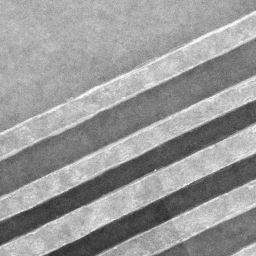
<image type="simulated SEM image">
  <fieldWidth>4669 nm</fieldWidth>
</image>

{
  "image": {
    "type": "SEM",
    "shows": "parallel lines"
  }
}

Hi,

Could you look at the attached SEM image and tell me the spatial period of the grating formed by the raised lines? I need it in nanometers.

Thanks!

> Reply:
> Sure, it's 947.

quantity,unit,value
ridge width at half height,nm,411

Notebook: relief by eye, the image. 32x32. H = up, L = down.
LLLLLLLLLLLLLLLLLLLLLLLLLLLLLLLL
LLLLLLLLLLLLLLLLLLLLLLLLLLLLLLLL
LLLLLLLLLLLLLLLLLLLLLLLLLLLLLLHH
LLLLLLLLLLLLLLLLLLLLLLLLLLLLHHHH
LLLLLLLLLLLLLLLLLLLLLLLLLLHHHHHH
LLLLLLLLLLLLLLLLLLLLLLLLHHHHHHLL
LLLLLLLLLLLLLLLLLLLLLLHHHHHHLLLL
LLLLLLLLLLLLLLLLLLLLHHHHHHLLLLLL
LLLLLLLLLLLLLLLLLLHHHHHHLLLLLLLL
LLLLLLLLLLLLLLLHHHHHHHLLLLLLLLLL
LLLLLLLLLLLLLHHHHHHHLLLLLLLLLLHH
LLLLLLLLLLLHHHHHHLLLLLLLLLLLHHHH
LLLLLLLLLHHHHHHLLLLLLLLLLLHHHHHH
LLLLLLLHHHHHHHLLLLLLLLLLHHHHHLLL
LLLLLHHHHHHLLLLLLLLLLLHHHHHLLLLL
LLLHHHHHHLLLLLLLLLLLHHHHHLLLLLLL
HHHHHHHLLLLLLLLLLHHHHHHLLLLLLLHH
HHHHHLLLLLLLLLLHHHHHHLLLLLLLHHHH
HHHLLLLLLLLLLHHHHHHLLLLLLLHHHHHH
HLLLLLLLLLLHHHHHHLLLLLLLHHHHHHHL
LLLLLLLLLHHHHHHLLLLLLLHHHHHHHLLL
LLLLLLLHHHHHHLLLLLLLHHHHHHHLLLLL
LLLLLHHHHHHLLLLLLHHHHHHHHLLLLLLL
LLLHHHHHHLLLLLLHHHHHHHHLLLLLLLHH
LHHHHHHLLLLLLHHHHHHHHLLLLLLLHHHH
HHHHHLLLLLLHHHHHHHHLLLLLLHHHHHHH
HHHLLLLLLHHHHHHHLLLLLLLHHHHHHHLL
LLLLLLLHHHHHHHLLLLLLLHHHHHHHLLLL
LLLLLHHHHHHHLLLLLLLHHHHHHHLLLLLL
LLLHHHHHHHHLLLLLLHHHHHHHLLLLLLLL
LHHHHHHHLLLLLLLHHHHHHHLLLLLLLLLL
HHHHHHLLLLLLLHHHHHHHLLLLLLLLLLHH